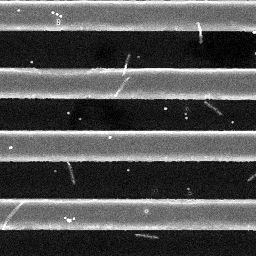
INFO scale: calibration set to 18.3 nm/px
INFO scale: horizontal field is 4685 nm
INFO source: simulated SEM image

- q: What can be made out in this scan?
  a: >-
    lines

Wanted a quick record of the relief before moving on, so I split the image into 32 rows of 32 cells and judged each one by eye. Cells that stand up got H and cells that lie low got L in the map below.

HHHHHHHHHHHHHHHHHHHHHHHHHHHHHHHH
HHHHHHHHHHHHHHHHHHHHHHHHHHHHHHHH
HHHHHHHHHHHHHHHHHHHHHHHHHHHHHHHH
HHHHHHHHHHHHHHHHHHHHLLLHHHHHHHHH
LLLLLLLLLLLLLLLLLLLLLLLLLLLLLLLL
LLLLLLLLLLLLLLLLLLLLLLLLLLLLLLLL
LLLLLLLLLLLLLLLLLLLLLLLLLLLLLLLL
LLLLLLLLLLLLLLLLLLLLLLLLLLLLLLLL
LLLLLLLLLLLLLLLLLLLLLLLLLLLLLLLL
HHHHHHHHHHHHHHHHHHHHHHHHHHHHHHHH
HHHHHHHHHHHHHHHHHHHHHHHHHHHHHHHH
HHHHHHHHHHHHHHHHHHHHHHHHHHHHHHHH
LLLLLLLLLLLLLLLLLLLLLLLLLLLLLLLL
LLLLLLLLLLLLLLLLLLLLLLLLLLLLLLLL
LLLLLLLLLLLLLLLLLLLLLLLLLLLLLLLL
LLLLLLLLLLLLLLLLLLLLLLLLLLLLLLLL
HHHHHHHHHHHHHHHHHHHHHHHHHHHHHHHH
HHHHHHHHHHHHHHHHHHHHHHHHHHHHHHHH
HHHHHHHHHHHHHHHHHHHHHHHHHHHHHHHH
HHHHHHHHHHHHHHHHHHHHHHHHHHHHHHHH
LLLLLLLLLLLLLLLLLLLLLLLLLLLLLLLL
LLLLLLLLLLLLLLLLLLLLLLLLLLLLLLLL
LLLLLLLLLLLLLLLLLLLLLLLLLLLLLLLL
LLLLLLLLLLLLLLLLLLLLLLLLLLLLLLLL
LLLLLLLLLLLLLLLLLLLLLLLLLLLLLLLL
HHHHHHHHHHHHHHHHHHHHHHHHHHHHHHHH
HHHHHHHHHHHHHHHHHHHHHHHHHHHHHHHH
HHHHHHHHHHHHHHHHHHHHHHHHHHHHHHHH
HHLLLLLLLLHHLHHHHHHHHLLLLLLLHHHH
LLLLLLLLLLLLLLLLLLLLLLLLLLLLLLLL
LLLLLLLLLLLLLLLLLLLLLLLLLLLLLLLL
LLLLLLLLLLLLLLLLLLLLLLLLLLLLLLLL